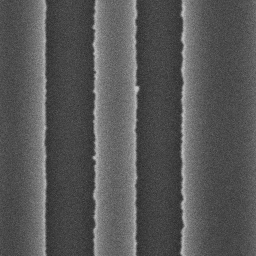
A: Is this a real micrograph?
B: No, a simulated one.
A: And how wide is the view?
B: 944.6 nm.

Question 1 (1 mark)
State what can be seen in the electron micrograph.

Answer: lines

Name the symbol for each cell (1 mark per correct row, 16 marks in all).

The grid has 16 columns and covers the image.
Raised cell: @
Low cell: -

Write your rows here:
@@@---@@---@@@@@
@@@---@@---@@@@@
@@@---@@---@@@@@
@@@---@@---@@@@@
@@@---@@---@@@@@
@@@---@@@--@@@@@
@@@---@@@--@@@@@
@@@---@@---@@@@@
@@@---@@---@@@@@
@@@---@@---@@@@@
@@@---@@---@@@@@
@@@---@@---@@@@@
@@@---@@---@@@@@
@@@---@@---@@@@@
@@@---@@---@@@@@
@@@---@@---@@@@@